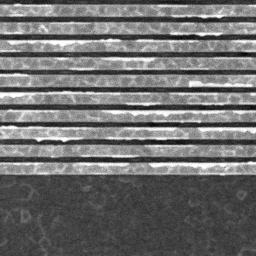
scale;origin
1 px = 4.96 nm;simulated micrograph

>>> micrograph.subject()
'parallel lines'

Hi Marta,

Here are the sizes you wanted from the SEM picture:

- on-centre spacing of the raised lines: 87.1 nm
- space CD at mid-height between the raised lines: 30.4 nm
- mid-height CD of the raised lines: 57.7 nanometres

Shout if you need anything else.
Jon